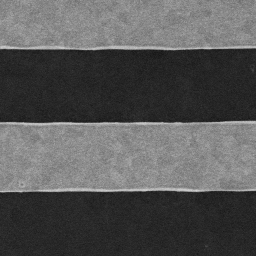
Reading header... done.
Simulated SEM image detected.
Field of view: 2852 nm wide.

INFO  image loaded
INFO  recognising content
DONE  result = wiring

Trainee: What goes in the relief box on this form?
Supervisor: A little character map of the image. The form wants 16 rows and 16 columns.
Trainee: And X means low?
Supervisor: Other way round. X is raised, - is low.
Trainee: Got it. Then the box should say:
XXXXXXXXXXXXXXXX
XXXXXXXXXXXXXXXX
XXXXXXXXXXXXXXXX
----------------
----------------
----------------
----------------
----------------
XXXXXXXXXXXXXXXX
XXXXXXXXXXXXXXXX
XXXXXXXXXXXXXXXX
XXXXXXXXXXXXXXXX
----------------
----------------
----------------
----------------